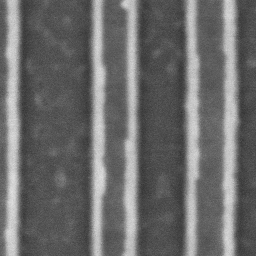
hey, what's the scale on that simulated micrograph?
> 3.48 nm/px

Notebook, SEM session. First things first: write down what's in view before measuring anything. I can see one or a few lines or trenches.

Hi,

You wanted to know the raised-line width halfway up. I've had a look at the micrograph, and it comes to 130 nm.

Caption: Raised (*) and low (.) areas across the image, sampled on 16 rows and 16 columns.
*.....**....**..
*.....**....**..
*.....**....**..
*.....**....**..
*.....**....**..
*.....**....**..
*.....**....**..
*.....**....**..
*.....**....**..
*.....**....**..
*.....**....**..
*.....**....**..
*.....**....**..
*.....**....**..
*.....**....**..
*.....**....**..